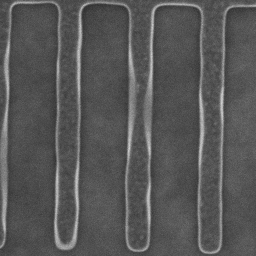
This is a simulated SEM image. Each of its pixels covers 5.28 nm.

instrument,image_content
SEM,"groups of lines, slits or small figures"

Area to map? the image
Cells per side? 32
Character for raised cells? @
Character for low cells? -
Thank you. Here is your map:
@@-----@@@@---@@@@@@@@@@@@@@@@@@
@------@@@------@@@------@@@----
@------@@@------@@@------@@@----
@------@@@------@@@------@@@----
@------@@@------@@@------@@@----
@------@@@------@@@------@@@----
@------@@@------@@@------@@@----
@------@@@------@@@------@@@----
@------@@@------@@@------@@@----
@------@@@-------@@------@@@----
@------@@@-------@@------@@@----
@------@@@-------@@------@@@----
@------@@@-------@@------@@@----
@------@@@-------@-------@@@----
@------@@@------@@-------@@@----
@------@@@------@@-------@@@----
@------@@@------@@-------@@@----
@------@@@------@@@------@@@----
@------@@@------@@@------@@@----
-------@@@------@@@------@@@----
-------@@@------@@@------@@@----
@------@@@------@@@------@@@----
@------@@@------@@@------@@@----
@------@@-------@@@------@@@----
@------@@@------@@@------@@@----
@------@@@------@@@------@@@----
@------@@@------@@@------@@@----
@------@@@------@@@------@@@----
@------@@-------@@@------@@@----
@------@@-------@@@------@@@----
-------@@-------@@@------@@@----
--------------------------@-----